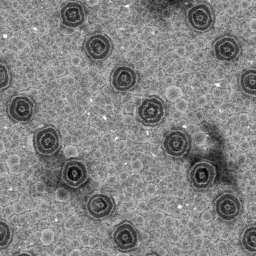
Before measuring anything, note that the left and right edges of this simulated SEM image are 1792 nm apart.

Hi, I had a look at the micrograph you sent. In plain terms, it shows a regular array of ring-shaped raised bodies with a dot in the middle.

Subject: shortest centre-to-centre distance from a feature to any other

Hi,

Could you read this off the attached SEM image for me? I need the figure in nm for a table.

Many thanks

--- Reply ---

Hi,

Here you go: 288